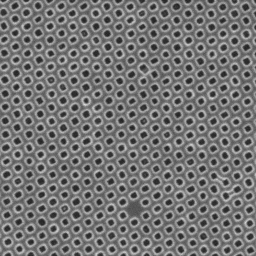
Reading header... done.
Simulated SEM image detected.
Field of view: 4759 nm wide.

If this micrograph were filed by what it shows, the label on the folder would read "a regular array of holes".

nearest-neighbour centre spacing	243	nm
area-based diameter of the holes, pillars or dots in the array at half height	134	nanometers